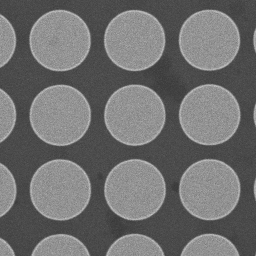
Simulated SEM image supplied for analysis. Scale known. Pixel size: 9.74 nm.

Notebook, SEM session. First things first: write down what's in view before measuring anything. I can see an array of small figures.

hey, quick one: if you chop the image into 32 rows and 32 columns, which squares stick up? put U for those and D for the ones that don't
DDDDDDDDDDDDDDDDDDDDDDDDDDDDDDDD
DDDDDDUUUDDDDDDDUUDDDDDDDUUUDDDD
UDDDDUUUUUDDDDUUUUUUDDDUUUUUUDDD
UUDDUUUUUUUDDUUUUUUUDDDUUUUUUUDD
UUDDUUUUUUUDDUUUUUUUUDUUUUUUUUDD
UUDDUUUUUUUDDUUUUUUUUDUUUUUUUUDD
UUDDUUUUUUUDDUUUUUUUDDDUUUUUUUDD
UDDDDUUUUUDDDDUUUUUUDDDUUUUUUDDD
DDDDDDUUUDDDDDDUUUDDDDDDDUUUDDDD
DDDDDDDDDDDDDDDDDDDDDDDDDDDDDDDD
DDDDDDDDDDDDDDDDDDDDDDDDDDDDDDDD
UDDDDUUUUUDDDDUUUUUDDDDDUUUUUDDD
UDDDUUUUUUUDDDUUUUUUDDDUUUUUUUDD
UUDDUUUUUUUDDUUUUUUUUDDUUUUUUUDD
UUDDUUUUUUUDDUUUUUUUUDUUUUUUUUDD
UUDDUUUUUUUDDUUUUUUUUDDUUUUUUUDD
UDDDUUUUUUUDDDUUUUUUDDDUUUUUUDDD
UDDDDUUUUUDDDDDUUUUDDDDDUUUUDDDD
DDDDDDDDDDDDDDDDDDDDDDDDDDDDDDDD
DDDDDDDDDDDDDDDDDDDDDDDDDDDDDDDD
DDDDDDUUUUDDDDDUUUUDDDDDUUUUDDDD
UDDDUUUUUUUDDDUUUUUUDDDUUUUUUDDD
UUDDUUUUUUUDDUUUUUUUUDDUUUUUUUDD
UUDDUUUUUUUDDUUUUUUUUDUUUUUUUUDD
UUDDUUUUUUUDDUUUUUUUUDUUUUUUUUDD
UUDDUUUUUUUDDUUUUUUUDDDUUUUUUUDD
UDDDDUUUUUDDDDUUUUUDDDDDUUUUUDDD
DDDDDDDDDDDDDDDDDDDDDDDDDDDDDDDD
DDDDDDDDDDDDDDDDDDDDDDDDDDDDDDDD
DDDDDDUUUDDDDDDUUUDDDDDDDUUUDDDD
UDDDDUUUUUDDDDUUUUUUDDDUUUUUUDDD
UUDDUUUUUUUDDUUUUUUUDDDUUUUUUUDD